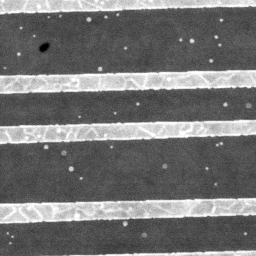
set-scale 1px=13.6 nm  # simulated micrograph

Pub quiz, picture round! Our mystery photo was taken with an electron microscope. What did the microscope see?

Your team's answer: lines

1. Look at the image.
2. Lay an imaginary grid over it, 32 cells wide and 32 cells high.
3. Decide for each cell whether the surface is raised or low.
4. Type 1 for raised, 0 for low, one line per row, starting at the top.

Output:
11111111111111111111111111111111
11111000000000000000000000000000
00000000000000000000000000000000
00000000000000000000000000000000
00000000000000000000000000000000
00000000000000000000000000000000
00000000000000000000000000000000
00000000000000000000000000000000
00000000000000000000000000000000
00000001111111111111111111111111
11111111111111111111111111111111
11110000000000000000000000000000
00000000000000000000000000000000
00000000000000000000000000000000
00000000000000000000000000000000
00000000000000001111111111111111
11111111111111111111111111111111
11111111111000000000000000000000
00000000000000000000000000000000
00000000000000000000000000000000
00000000000000000000000000000000
00000000000000000000000000000000
00000000000000000000000000000000
00000000000000000000000000000000
00000000000000000000000000000000
00000111111111111111111111111111
11111111111111111111111111111111
11111111100000000000000000000000
00000000000000000000000000000000
00000000000000000000000000000000
00000000000000000000000000000000
00000000000000000000000000000011